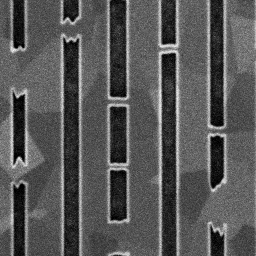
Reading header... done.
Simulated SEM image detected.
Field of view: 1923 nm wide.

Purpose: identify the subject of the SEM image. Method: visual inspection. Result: parallel lines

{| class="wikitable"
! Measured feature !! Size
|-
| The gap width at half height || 0.12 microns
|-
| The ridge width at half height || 32.9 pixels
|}